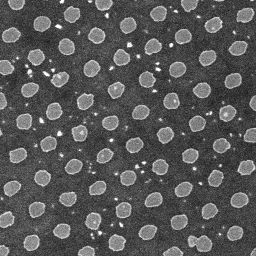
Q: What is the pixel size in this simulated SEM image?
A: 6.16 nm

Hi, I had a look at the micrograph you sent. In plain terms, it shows a regular array of raised bodies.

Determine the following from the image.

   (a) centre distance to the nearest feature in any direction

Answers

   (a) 32.1 px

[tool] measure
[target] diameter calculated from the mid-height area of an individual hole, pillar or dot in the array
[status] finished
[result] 95.6 nanometers